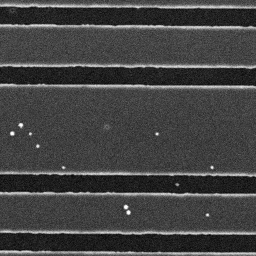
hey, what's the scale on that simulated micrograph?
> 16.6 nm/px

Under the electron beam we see lines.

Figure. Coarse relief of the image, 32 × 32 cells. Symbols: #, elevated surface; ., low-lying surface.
################################
................................
................................
################################
################################
################################
################################
################################
...............................#
................................
................................
################################
################################
################################
################################
################################
################################
################################
################################
################################
################################
################################
................................
................................
################################
################################
################################
################################
################################
................................
................................
####.##.........................